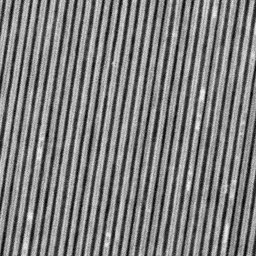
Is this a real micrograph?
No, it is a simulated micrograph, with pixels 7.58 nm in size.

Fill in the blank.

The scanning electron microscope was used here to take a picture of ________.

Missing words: parallel lines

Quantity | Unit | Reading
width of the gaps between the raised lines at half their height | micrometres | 0.0365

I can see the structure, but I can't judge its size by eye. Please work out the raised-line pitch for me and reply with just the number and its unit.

67.5 nm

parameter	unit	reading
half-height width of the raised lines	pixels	3.94